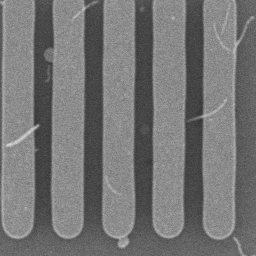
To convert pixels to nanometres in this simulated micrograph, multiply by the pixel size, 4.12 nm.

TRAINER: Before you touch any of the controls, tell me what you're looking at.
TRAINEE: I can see groups of lines, slits or small figures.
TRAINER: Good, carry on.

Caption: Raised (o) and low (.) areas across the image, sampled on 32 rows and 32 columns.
.ooo...ooo...oooo..oooo..oooo...
oooo...oooo..oooo..oooo..oooo...
oooo...ooo...oooo..oooo..ooooo..
oooo...ooo...oooo..oooo...ooo...
.ooo...ooo...oooo..oooo...ooo...
oooo...ooo...oooo..oooo...oooo..
oooo...ooo...oooo..oooo...ooo...
oooo...ooo...oooo..oooo...ooo...
oooo...ooo...oooo..oooo..oooo...
oooo...ooo...oooo..oooo..oooo...
oooo...ooo...oooo..oooo..oooo...
oooo...ooo...oooo..oooo..oooo...
oooo...ooo...oooo..oooo..oooo...
oooo...ooo...oooo..oooo..oooo...
oooo...ooo...oooo..oooo..oooo...
oooo...ooo...oooo..oooo..oooo...
oooo...ooo...oooo..oooo..oooo...
oooo...ooo...oooo..oooo..oooo...
oooo...ooo...oooo..oooo..oooo...
oooo...ooo...oooo..oooo..oooo...
oooo...ooo...oooo..oooo..oooo...
oooo...ooo...oooo..oooo..oooo...
oooo..oooo...oooo..oooo..oooo...
oooo..oooo...oooo..oooo..oooo...
oooo..oooo...oooo..oooo...ooo...
oooo...ooo...oooo..oooo..oooo...
oooo...ooo...oooo..oooo..oooo...
oooo...ooo...oooo..oooo..oooo...
.ooo...ooo...oooo..oooo...ooo...
.oo.....o.....oo....oo....oo....
................................
................................